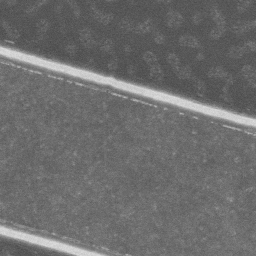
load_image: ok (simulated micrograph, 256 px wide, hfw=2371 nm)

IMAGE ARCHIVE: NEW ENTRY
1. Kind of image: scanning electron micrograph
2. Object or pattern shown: one or a few lines or trenches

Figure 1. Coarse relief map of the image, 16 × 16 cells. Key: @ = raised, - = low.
----------------
----------------
----------------
@---------------
@@@@@-----------
@@@@@@@@--------
@@@@@@@@@@@@----
@@@@@@@@@@@@@@@-
@@@@@@@@@@@@@@@@
@@@@@@@@@@@@@@@@
@@@@@@@@@@@@@@@@
@@@@@@@@@@@@@@@@
@@@@@@@@@@@@@@@@
@@@@@@@@@@@@@@@@
@@@@@@@@@@@@@@@@
----@@@@@@@@@@@@